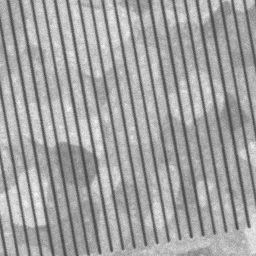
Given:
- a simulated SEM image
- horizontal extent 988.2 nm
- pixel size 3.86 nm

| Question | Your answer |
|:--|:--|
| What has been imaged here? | parallel lines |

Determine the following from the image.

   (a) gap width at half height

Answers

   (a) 12.8 nanometres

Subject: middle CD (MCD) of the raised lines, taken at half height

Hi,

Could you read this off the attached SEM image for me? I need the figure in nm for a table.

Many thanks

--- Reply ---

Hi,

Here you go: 32.7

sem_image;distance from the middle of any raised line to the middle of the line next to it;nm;44.8